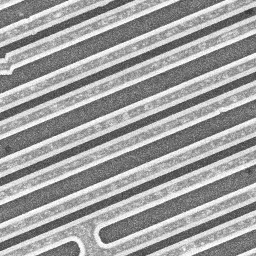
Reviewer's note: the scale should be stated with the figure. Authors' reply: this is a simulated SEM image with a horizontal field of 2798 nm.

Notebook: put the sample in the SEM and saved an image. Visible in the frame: parallel lines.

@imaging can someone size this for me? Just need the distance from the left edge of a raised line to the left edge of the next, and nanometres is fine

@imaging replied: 326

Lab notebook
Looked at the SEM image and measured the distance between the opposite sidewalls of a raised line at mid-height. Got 151 nm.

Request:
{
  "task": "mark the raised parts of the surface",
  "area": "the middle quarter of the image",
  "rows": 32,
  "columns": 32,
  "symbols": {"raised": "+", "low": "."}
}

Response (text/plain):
..++++++++........+++++++++.....
++++++++........+++++++++.......
+++++.........++++++++..........
++++........++++++++............
+........++++++++..............+
.......++++++++..............+++
....+++++++++..............+++++
.+++++++++...............+++++++
++++++++..............+++++++++.
+++++..............+++++++++....
+++..............+++++++++......
+..............++++++++........+
............+++++++++........+++
..........+++++++++........+++++
.......+++++++++........++++++++
.....+++++++++........+++++++++.
...++++++++........+++++++++....
.++++++++........+++++++++......
+++++++........++++++++.........
++++........+++++++++...........
++........+++++++++.............
.......+++++++++..............++
.....++++++++...............++++
..+++++++++..............+++++++
++++++++...............++++++++.
++++++..............+++++++++...
++++..............++++++++......
++..............++++++++........
.............+++++++++.......+++
...........++++++++........+++++
........+++++++++........+++++++
......++++++++........+++++++++.